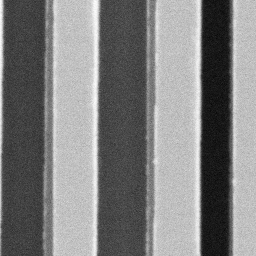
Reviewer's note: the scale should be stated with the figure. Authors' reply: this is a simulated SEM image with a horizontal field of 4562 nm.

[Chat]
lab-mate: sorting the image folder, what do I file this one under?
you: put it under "lines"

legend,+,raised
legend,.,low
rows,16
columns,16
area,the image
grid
...+++....+++..+
...+++....+++..+
...+++....+++..+
...+++....+++..+
...+++....+++..+
...+++....+++..+
...+++....+++..+
...+++....+++..+
...+++....+++..+
...+++....+++..+
...+++....+++..+
...+++....+++..+
...+++....+++..+
...+++....+++..+
...+++....++...+
...+++....++...+